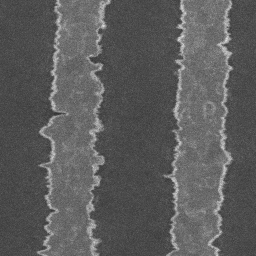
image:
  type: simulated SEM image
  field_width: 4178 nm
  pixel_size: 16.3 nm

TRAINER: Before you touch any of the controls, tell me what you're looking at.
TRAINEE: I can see one or a few lines or trenches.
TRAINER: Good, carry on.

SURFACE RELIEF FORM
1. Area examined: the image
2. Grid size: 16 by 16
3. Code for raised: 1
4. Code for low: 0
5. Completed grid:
0000110000011100
0000110000011100
0000110000011100
0000110000011100
0001110000011100
0001110000011100
0001110000011100
0001110000011100
0001110000011100
0001110000011100
0001110000011100
0001110000011100
0001110000011100
0001110000011100
0001110000011100
0001110000011000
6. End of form